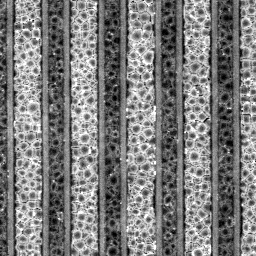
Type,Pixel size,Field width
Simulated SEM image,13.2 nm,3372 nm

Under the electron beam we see parallel lines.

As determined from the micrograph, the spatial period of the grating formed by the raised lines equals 744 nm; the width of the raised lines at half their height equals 285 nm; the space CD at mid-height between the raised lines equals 0.466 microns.